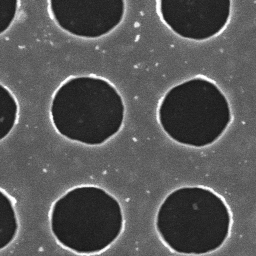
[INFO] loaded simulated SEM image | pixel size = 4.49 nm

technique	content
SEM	holes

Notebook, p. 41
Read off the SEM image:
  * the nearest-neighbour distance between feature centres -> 480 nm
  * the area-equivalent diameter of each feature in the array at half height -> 309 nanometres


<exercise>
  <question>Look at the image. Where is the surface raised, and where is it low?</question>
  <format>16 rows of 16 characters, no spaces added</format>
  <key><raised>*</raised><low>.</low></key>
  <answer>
.**.....**....**
.***...***....**
****************
****************
****************
****...****...**
.**.....**....**
.**.....**....**
****...****...**
****************
****************
****************
.***...***....**
.**.....**....**
.**....***....**
****..*****..***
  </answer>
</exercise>